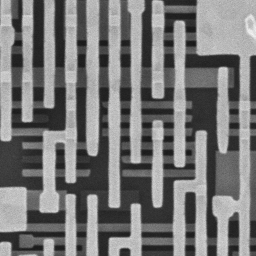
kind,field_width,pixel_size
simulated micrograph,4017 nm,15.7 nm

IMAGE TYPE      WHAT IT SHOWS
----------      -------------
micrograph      wiring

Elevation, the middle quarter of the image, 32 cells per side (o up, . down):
ooo...ooo..ooo...oo...ooo...oo..
ooo...ooo..ooo...oo...ooo...oo..
ooo...ooo..ooo...oo...ooo...oo..
ooo...ooo..ooo...oo...ooo...oo..
ooo...ooo..ooo...oo...ooo...oo..
.oo...ooo..ooo...oo...ooo...oo..
.oo...ooo..ooo...oo...ooo...oo..
.oo...ooo..ooo...oo...ooo...oo..
.oo...ooo..ooo...oo.........oo..
.oo...ooo..ooo...oo.........oo..
.oo...ooo..ooo...oo.........oo..
.oo...ooo..ooo...oo.........oo..
.oo...ooo..ooo...oo.........oo..
.oo...ooo..ooo...oo.........oo..
ooo...ooo..ooo...oo...ooo...oo..
ooo...ooo..ooo...oo...ooo...oo..
ooo...ooo..ooo...oo...ooo...oo..
ooo...ooo..ooo...oo...ooo...oo..
ooo...ooo..ooo...oo...ooo...oo..
ooo...ooo..ooo...oo...oo....oo..
ooo...ooo..ooo...oo...oo....oo..
ooo...oo...ooo...oo...oo....oo..
ooo...oo...ooo...oo...oo....oo..
ooo........ooo...oo...oo....oo..
ooo........ooo...oo...oo....oo..
ooo........ooo........ooo...oo..
ooo........ooo........ooo.......
ooo........ooo........ooo.......
ooo........ooo........ooo.......
.oo........ooo........oo....oooo
...........ooo........oo....oooo
...........ooo........oo....oooo